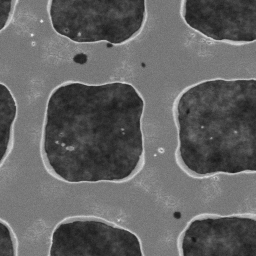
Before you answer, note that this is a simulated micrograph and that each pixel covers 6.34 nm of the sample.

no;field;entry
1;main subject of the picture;holes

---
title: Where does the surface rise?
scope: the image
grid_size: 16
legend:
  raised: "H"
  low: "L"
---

LHHLLLLLLHHHLLLL
HHHLLLLLLHHHLLLL
HHHHHLLLHHHHHHHL
HHHHHHHHHHHHHHHH
HHHHHHHHHHHHHHHH
HHHHLLLLHHHHLLLL
LHHLLLLLLHHLLLLL
LHHLLLLLLHHLLLLL
LHHLLLLLLHHLLLLL
HHHLLLLLLHHLLLLL
HHHLLLLLLHHHLLLL
HHHHHHHHHHHHHHHH
HHHHHHHHHHHHHHHH
HHHHHHHHHHHHHHHH
LHHLLLLLHHHHLLLL
LHHLLLLLLHHLLLLL